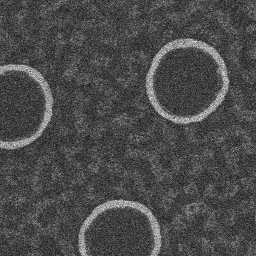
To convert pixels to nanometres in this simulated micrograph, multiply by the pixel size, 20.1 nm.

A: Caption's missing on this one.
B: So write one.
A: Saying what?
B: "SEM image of raised bodies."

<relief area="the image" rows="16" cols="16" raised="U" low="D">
DDDDDDDDDDDDDDDD
DDDDDDDDDDDDDDDD
DDDDDDDDDDDDDDDD
DDDDDDDDDDUUUDDD
UUDDDDDDDUUUUUDD
UUUDDDDDDUUUUUDD
UUUDDDDDDDUUUDDD
UUUDDDDDDDDUDDDD
UUDDDDDDDDDDDDDD
DDDDDDDDDDDDDDDD
DDDDDDDDDDDDDDDD
DDDDDDDDDDDDDDDD
DDDDDDDDDDDDDDDD
DDDDDDUUUDDDDDDD
DDDDDUUUUUDDDDDD
DDDDDUUUUUDDDDDD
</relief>